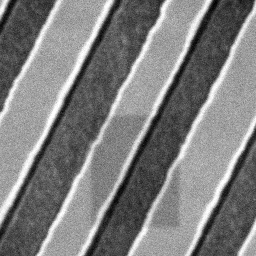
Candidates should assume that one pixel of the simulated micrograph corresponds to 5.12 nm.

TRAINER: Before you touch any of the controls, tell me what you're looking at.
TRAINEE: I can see lines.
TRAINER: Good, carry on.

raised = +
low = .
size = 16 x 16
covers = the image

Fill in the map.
...++++...+++...
...+++....++...+
..++++...+++...+
..+++....+++..++
.++++...+++...++
.+++....+++..+++
++++...+++...+++
+++....++...++++
+++...+++...++++
++....++...++++.
++...+++...++++.
+....+++..++++..
+...+++...++++..
....++...++++...
...+++...++++...
...++...++++...+